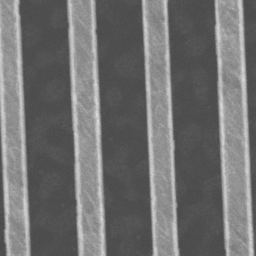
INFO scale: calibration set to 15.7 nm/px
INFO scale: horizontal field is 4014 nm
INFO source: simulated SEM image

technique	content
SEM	one or a few lines or trenches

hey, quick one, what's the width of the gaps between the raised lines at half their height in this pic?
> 822 nanometers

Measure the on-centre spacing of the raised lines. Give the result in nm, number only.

1160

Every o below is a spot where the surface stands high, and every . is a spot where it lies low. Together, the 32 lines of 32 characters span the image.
oo.......oo.......ooo......ooo..
oo.......oo.......ooo......ooo..
oo.......ooo......ooo......ooo..
oo.......ooo......ooo......ooo..
oo.......ooo......ooo......ooo..
oo.......ooo......ooo......ooo..
oo.......ooo......ooo......ooo..
oo.......ooo......ooo.......oo..
oo.......ooo......ooo.......oo..
oo.......ooo......ooo.......oo..
oo.......ooo.......oo.......oo..
oo.......ooo.......oo.......ooo.
ooo......ooo.......oo.......ooo.
ooo......ooo.......oo.......ooo.
ooo......ooo.......oo.......ooo.
.oo.......oo.......oo.......ooo.
.oo.......oo.......oo.......ooo.
.oo.......oo.......oo.......ooo.
.oo.......oo.......oo.......ooo.
.oo.......oo.......oo.......ooo.
.oo.......oo.......oo.......ooo.
.oo.......oo.......oo.......ooo.
.oo.......oo.......ooo......ooo.
.oo.......oo.......ooo......ooo.
.oo.......ooo......ooo......ooo.
.oo.......ooo......ooo......ooo.
.oo.......ooo......ooo......ooo.
.oo.......ooo......ooo......ooo.
.oo.......ooo......ooo......ooo.
.oo.......ooo......ooo......ooo.
.oo.......ooo......ooo.......oo.
.oo.......ooo......ooo.......oo.